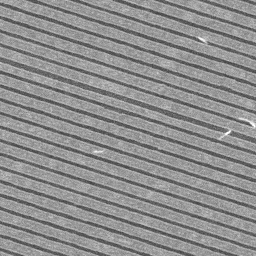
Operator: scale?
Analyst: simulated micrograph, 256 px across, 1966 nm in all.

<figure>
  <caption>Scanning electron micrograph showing parallel lines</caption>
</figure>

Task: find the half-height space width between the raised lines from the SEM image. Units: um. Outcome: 0.0329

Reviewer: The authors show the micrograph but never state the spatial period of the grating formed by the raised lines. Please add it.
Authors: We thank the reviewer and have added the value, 99.8 nm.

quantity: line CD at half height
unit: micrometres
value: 0.0658